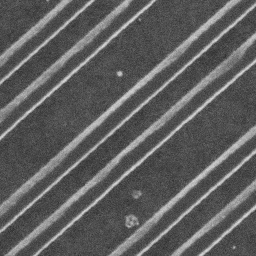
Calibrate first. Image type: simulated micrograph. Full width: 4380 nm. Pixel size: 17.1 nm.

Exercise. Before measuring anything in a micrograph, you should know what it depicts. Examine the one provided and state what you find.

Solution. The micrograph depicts lines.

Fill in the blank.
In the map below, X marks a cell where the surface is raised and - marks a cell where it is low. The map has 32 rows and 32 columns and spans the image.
--------XXX-----XXX----------XXX
-------XXX-----XXX----------XXX-
------XXX-----XXX----------XXX--
-----XXX----XXXX----------XXX---
---XXXX----XXX----------XXXX----
--XXX-----XXX----------XXX-----X
-XXX-----XXX----------XXX-----XX
XXX-----XXX----------XXX-----XXX
XX-----XXX----------XXX-----XXX-
X-----XXX----------XXX-----XXX--
-----XXX---------XXXX----XXXX---
---XXXX---------XXXX----XXX-----
--XXX----------XXXX----XXX------
-XXX----------XXX-----XXX-------
XXX----------XXX-----XXX--------
XX----------XXX-----XXX---------
X----------XXX----XXXX----------
----------XXX----XXXX---------XX
---------XXX----XXXX---------XXX
--------XXX----XXX----------XXX-
-------XXX----XXX----------XXX--
-----XXX-----XXX----------XXX---
----XXX-----XXX----------XXX----
---XXX-----XXX----------XXX----X
--XXX-----XXX---------XXXX----XX
-XXX----XXXX---------XXXX----XXX
XXX----XXXX---------XXX-----XXX-
XX----XXX----------XXX-----XXX--
X----XXX----------XXX-----XXX---
----XXX----------XXX-----XXX----
---XXX----------XXX----XXXX-----
--XXX----------XXX----XXXX------